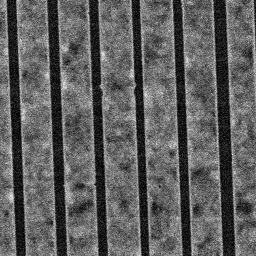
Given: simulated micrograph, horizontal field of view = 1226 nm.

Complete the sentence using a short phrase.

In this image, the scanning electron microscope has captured parallel lines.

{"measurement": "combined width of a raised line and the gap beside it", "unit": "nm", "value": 198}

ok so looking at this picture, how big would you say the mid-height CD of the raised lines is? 144 nm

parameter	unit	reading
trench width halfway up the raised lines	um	0.049